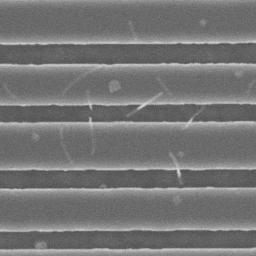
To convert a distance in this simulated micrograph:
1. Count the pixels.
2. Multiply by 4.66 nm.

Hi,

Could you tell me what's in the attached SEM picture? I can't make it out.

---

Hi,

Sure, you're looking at lines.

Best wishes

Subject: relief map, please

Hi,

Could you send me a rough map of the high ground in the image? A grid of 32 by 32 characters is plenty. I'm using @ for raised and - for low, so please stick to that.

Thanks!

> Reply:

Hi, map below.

@@@@@@@@@@@@@@@@@@@@@@@@@@@@@@@@
@@@@@@@@@@@@@@@@@@@@@@@@@@@@@@@@
@@@@@@@@@@@@@@@@@@@@@@@@@@@@@@@@
@@@@@@@@@@@@@@@@@@@@@@@@@@@@@@@@
@@@@@@@@@@@@@@@@@@@@@@@@@@@@@@@@
@@@@-@---@----------------------
--------------------------------
--------------------------------
@@@@@@@@@@@@@@@@@@@@@@@@@@@@@@@@
@@@@@@@@@@@@@@@@@@@@@@@@@@@@@@@@
@@@@@@@@@@@@@@@@@@@@@@@@@@@@@@@@
@@@@@@@@@@@@@@@@@@@@@@@@@@@@@@@@
@@@@@@@@@@@@@@@@@@@@@@@@@@@@@@@@
--------------------------------
--------------------------------
@@@@@@@@@@@@@@@@@@@@@@@@@@@@@@@@
@@@@@@@@@@@@@@@@@@@@@@@@@@@@@@@@
@@@@@@@@@@@@@@@@@@@@@@@@@@@@@@@@
@@@@@@@@@@@@@@@@@@@@@@@@@@@@@@@@
@@@@@@@@@@@@@@@@@@@@@@@@@@@@@@@@
@@@@@@@@@@@@@@@@@@@@@@@@@@@@@@@@
--------------------------------
--------------------------------
-------------------------@@-----
@@@@@@@@@@@@@@@@@@@@@@@@@@@@@@@@
@@@@@@@@@@@@@@@@@@@@@@@@@@@@@@@@
@@@@@@@@@@@@@@@@@@@@@@@@@@@@@@@@
@@@@@@@@@@@@@@@@@@@@@@@@@@@@@@@@
@@@@@@@@@@@@@@@@@@@@@@@@@@@@@@@@
--------------------------------
--------------------------------
@@@@@@@@@@@@@@@@@@@@@@@@@@@@@@@@